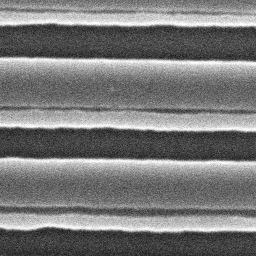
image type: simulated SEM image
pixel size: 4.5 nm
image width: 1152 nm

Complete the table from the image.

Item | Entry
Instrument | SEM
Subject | lines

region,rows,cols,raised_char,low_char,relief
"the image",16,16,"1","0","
1111111111111111
0000000111011111
0000000000000000
0000000000000000
1111111111111111
1111111111111111
1111111111111111
1111111111111111
0000000000000000
0000000000000000
1111111111111111
1111111111111111
1111111111111111
1111111111111111
0000000000000000
0000000000000000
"